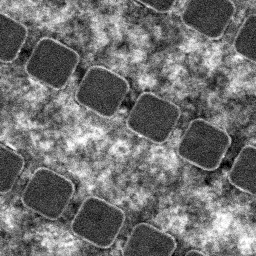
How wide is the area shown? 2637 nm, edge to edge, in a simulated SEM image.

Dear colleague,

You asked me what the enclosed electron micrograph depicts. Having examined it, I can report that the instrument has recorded raised bodies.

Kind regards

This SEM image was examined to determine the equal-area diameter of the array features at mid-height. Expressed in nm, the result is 503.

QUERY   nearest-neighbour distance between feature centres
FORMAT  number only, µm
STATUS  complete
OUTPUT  0.59